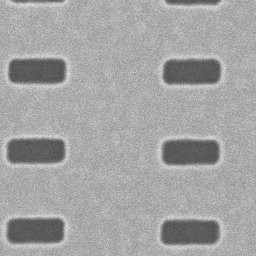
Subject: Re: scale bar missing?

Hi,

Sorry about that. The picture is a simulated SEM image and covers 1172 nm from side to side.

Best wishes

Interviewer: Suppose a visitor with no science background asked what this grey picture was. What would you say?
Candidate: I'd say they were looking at holes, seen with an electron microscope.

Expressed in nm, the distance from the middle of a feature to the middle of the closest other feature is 367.